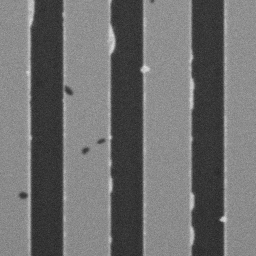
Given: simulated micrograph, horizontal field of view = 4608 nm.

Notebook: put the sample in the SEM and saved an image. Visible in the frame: lines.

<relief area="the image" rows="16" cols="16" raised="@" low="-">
@@--@@@--@@@--@@
@@--@@@--@@@--@@
@@--@@@--@@@--@@
@@--@@@--@@@--@@
@@--@@@--@@@--@@
@@--@@@--@@@--@@
@@--@@@--@@@--@@
@@--@@@--@@@--@@
@@--@@@--@@@--@@
@@--@@@--@@@--@@
@@--@@@--@@@--@@
@@--@@@--@@@--@@
@@--@@@--@@@--@@
@@--@@@--@@@--@@
@@--@@@--@@@--@@
@@--@@@--@@@--@@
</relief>